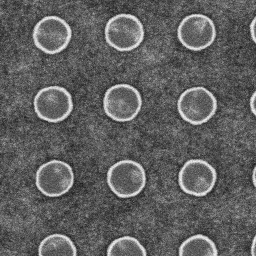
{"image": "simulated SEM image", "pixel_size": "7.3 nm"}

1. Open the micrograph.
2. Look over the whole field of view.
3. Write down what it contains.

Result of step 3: a regular array of raised bodies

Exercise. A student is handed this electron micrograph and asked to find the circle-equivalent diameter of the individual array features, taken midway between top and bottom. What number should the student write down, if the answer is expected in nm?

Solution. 260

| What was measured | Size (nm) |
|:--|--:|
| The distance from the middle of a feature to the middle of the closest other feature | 515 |